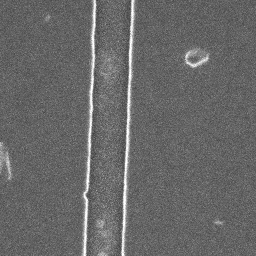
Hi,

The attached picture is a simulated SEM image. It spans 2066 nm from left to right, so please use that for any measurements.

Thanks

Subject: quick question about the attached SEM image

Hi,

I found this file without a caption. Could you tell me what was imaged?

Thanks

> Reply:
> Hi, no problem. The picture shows one or a few lines or trenches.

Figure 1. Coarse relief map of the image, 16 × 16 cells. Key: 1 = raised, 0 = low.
1111110011111111
1111110011111111
1111110011111111
1111110011111111
1111110011111111
1111110011111111
1111110011111111
1111110011111111
1111110011111111
1111110011111111
1111110011111111
1111100011111111
1111100011111111
1111100011111111
1111100011111111
1111100011111111